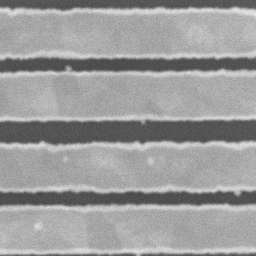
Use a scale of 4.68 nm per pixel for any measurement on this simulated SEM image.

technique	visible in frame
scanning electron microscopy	lines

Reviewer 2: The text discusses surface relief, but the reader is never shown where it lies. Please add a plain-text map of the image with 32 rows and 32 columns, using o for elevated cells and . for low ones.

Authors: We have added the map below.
................................
oooooooooooooooooooooooooooooooo
oooooooooooooooooooooooooooooooo
oooooooooooooooooooooooooooooooo
oooooooooooooooooooooooooooooooo
oooooooooooooooooooooooooooooooo
oooooooooooooooooooooooooooooooo
................................
................................
oooooooooooooooooooooooooooooooo
oooooooooooooooooooooooooooooooo
oooooooooooooooooooooooooooooooo
oooooooooooooooooooooooooooooooo
oooooooooooooooooooooooooooooooo
oooooooooooooooooooooooooooooooo
................................
................................
................................
oooooooooooooooooooooooooooooooo
oooooooooooooooooooooooooooooooo
oooooooooooooooooooooooooooooooo
oooooooooooooooooooooooooooooooo
oooooooooooooooooooooooooooooooo
oooooooooooooooooooooooooooooooo
................................
................................
oooooooooooooooooooooooooooooooo
oooooooooooooooooooooooooooooooo
oooooooooooooooooooooooooooooooo
oooooooooooooooooooooooooooooooo
oooooooooooooooooooooooooooooooo
ooooooooo...ooo.......o.oo......